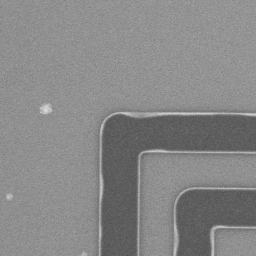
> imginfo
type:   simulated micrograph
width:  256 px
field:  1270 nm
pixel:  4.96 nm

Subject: groups of lines, slits or small figures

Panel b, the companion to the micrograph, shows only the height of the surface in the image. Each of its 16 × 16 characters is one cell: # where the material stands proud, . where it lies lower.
................
................
................
................
................
................
................
.......#########
......##########
......###...####
......###.......
......###.......
......###..#####
......###..#####
......###..##...
......###..##...